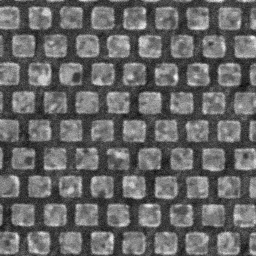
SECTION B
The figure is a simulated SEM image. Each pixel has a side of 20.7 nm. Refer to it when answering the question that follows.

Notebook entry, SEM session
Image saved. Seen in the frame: a regular array of raised bodies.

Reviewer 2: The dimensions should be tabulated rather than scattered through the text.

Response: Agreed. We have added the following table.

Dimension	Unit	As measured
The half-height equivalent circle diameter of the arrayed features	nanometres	476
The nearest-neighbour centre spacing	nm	653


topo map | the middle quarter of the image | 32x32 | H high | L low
HHHHLLLHHHHHLLLHHHHHLLLHHHHHLLLH
HHHHLLLHHHHHLLLHHHHHLLLHHHHHLLLH
HHHHLLLHHHHHLLLHHHHHLLLHHHHHLLLH
HHHHLLLHHHHHLLLHHHHHLLLHHHHHLLLH
HHHHLLLHHHHHLLLHHHHHLLLHHHHHLLLH
LLLLLLLLLLLLLLLLLLLLLLLLLLLLLLLL
LLLLLLLLLLLLLLLLLLLLLLLLLLLLLLLL
LLLLHHHHLLLHHHHHLLLHHHHHLLLHHHHH
LLLHHHHHLLLHHHHHLLLHHHHHLLLHHHHH
LLLHHHHHLLLHHHHHLLLHHHHHLLLHHHHH
LLLHHHHHLLLHHHHHLLLHHHHHLLLHHHHH
LLLHHHHHLLLHHHHHLLLHHHHHLLLHHHHH
LLLLLLLLLLLLLLLLLLLLLLLLLLLLLLLL
LLLLLLLLLLLLLLLLLLLLLLLLLLLLLLLL
HHHHLLLHHHHHLLLHHHHHLLLHHHHHLLLH
HHHHLLLHHHHHLLLHHHHHLLLHHHHHLLLH
HHHHLLLHHHHHLLLHHHHHLLLHHHHHLLLH
HHHHLLLHHHHHLLLHHHHHLLLHHHHHLLLH
HHHHLLLHHHHHLLLHHHHHLLLHHHHHLLLH
LLLLLLLLLLLLLLLLLLLLLLLLLLLLLLLL
LLLLLLLLLLLLLLLLLLLLLLLLLLLLLLLL
LLLHHHHHLLLHHHHHLLLHHHHHLLLHHHHH
LLLHHHHHLLLHHHHHLLLHHHHHLLLHHHHH
LLLHHHHHLLLHHHHHLLLHHHHHLLLHHHHH
LLLHHHHHLLLHHHHHLLLHHHHHLLLHHHHH
LLLHHHHHLLLHHHHHLLLHHHHHLLLHHHHH
LLLLLLLLLLLLLLLLLLLLLLLLLLLLLLLL
LLLLLLLLLLLLLLLLLLLLLLLLLLLLLLLL
HHHHLLLHHHHHLLLHHHHHLLLHHHHHLLLH
HHHHLLLHHHHHLLLHHHHHLLLHHHHHLLLH
HHHHLLLHHHHHLLLHHHHHLLLHHHHHLLLH
HHHHLLLHHHHHLLLHHHHHLLLHHHHHLLLH